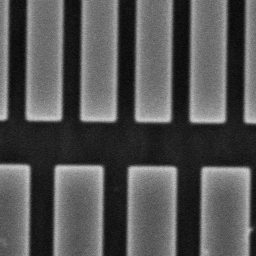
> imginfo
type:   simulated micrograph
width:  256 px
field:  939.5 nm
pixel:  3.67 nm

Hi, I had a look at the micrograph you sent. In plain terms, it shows groups of lines, slits or small figures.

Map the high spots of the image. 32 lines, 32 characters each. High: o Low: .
o..ooooo..ooooo..oooo...oooo...o
o..ooooo..ooooo..oooo...oooo...o
o..ooooo..ooooo..oooo...oooo...o
o..ooooo..ooooo..oooo...oooo...o
o..ooooo..ooooo..oooo...oooo...o
o..ooooo..ooooo..oooo...oooo...o
o..ooooo..ooooo..oooo...oooo...o
o..ooooo..ooooo..oooo...oooo...o
o..ooooo..ooooo..oooo...oooo...o
o..ooooo..ooooo..oooo...oooo...o
o..ooooo..ooooo..oooo...oooo...o
o..ooooo..ooooo..oooo...oooo...o
o..ooooo..ooooo..oooo...oooo...o
o..ooooo..ooooo..oooo...oooo...o
o..ooooo..oooo...oooo...oooo...o
................................
................................
................................
................................
................................
................................
oooo...oooooo...oooooo...oooooo.
oooo...oooooo...oooooo...oooooo.
oooo...oooooo...oooooo...oooooo.
oooo...oooooo...oooooo...oooooo.
oooo...oooooo...oooooo...oooooo.
oooo...oooooo...oooooo...oooooo.
oooo...oooooo...oooooo...oooooo.
oooo...oooooo...oooooo...oooooo.
oooo...oooooo...oooooo...oooooo.
oooo...oooooo...oooooo...oooooo.
oooo...oooooo...oooooo...oooooo.